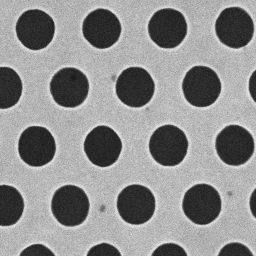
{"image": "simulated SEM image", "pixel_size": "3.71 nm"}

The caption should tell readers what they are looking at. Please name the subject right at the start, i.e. a regular array of holes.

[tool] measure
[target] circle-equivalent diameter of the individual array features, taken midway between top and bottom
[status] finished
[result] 146 nm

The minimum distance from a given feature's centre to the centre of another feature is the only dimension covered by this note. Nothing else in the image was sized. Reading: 244 nm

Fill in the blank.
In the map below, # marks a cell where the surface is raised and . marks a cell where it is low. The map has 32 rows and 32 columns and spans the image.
################################
###...######..######..######...#
##.....####....####....####....#
##.....###.....####....####.....
##.....####....####....####.....
###...#####...######..######...#
################################
################################
.###############..######..######
..#####....####....####....####.
...###.....####....####.....###.
...###.....####....####.....###.
..#####...#####....####....#####
.###############################
################################
################################
###...#####...#####....#####...#
##.....####....####....####.....
##.....####....####....####.....
###....####....####....####....#
###...######..######..#######.##
################################
################################
..######..######..######...#####
...####....####....####....####.
...###.....####....####.....###.
...####....####....####....#####
..#####....####....#####...#####
################################
################################
####.#######.#######..#######.##
###...#####....####....####....#